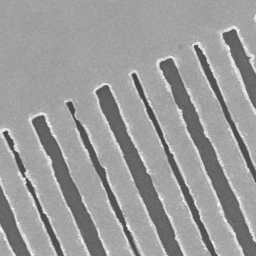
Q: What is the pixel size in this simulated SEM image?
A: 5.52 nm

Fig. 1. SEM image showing parallel lines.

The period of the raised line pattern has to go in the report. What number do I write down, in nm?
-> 190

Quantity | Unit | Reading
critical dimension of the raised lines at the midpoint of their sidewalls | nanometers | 134